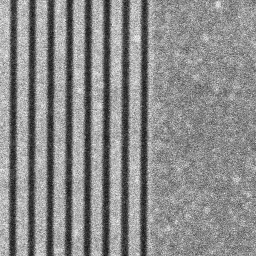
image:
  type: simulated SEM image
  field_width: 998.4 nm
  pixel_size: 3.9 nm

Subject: parallel lines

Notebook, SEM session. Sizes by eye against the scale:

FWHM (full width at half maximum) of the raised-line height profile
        44.3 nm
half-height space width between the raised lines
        30.7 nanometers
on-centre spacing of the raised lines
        18.7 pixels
